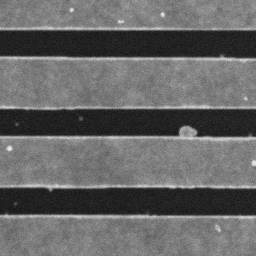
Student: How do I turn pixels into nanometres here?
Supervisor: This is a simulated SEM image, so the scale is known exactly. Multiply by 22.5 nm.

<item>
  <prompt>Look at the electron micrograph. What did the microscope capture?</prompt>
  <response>lines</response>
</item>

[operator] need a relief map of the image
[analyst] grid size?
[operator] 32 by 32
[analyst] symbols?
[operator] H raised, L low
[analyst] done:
HHHHHHHHHHHHHHHHHHHHHHHHHHHHHHHH
HHHHHHHHHHHHHHHHHHHHHHHHHHHHHHHH
HHHHHHHHHHHHHHHHHHHHHHHHHHHHHHHH
HHHHHHHHHHHHHHHHHHHHHHHHHHHHHHHH
LLLLLLLLLLLLLLLLLLLLLLLLLLLLLLLL
LLLLLLLLLLLLLLLLLLLLLLLLLLLLLLLL
LLLLLLLLLLLLLLLLLLLLLLLLLLLLLLLL
HHHHHHHHHHHHHHHHHHHHHHHHHHHHHHHH
HHHHHHHHHHHHHHHHHHHHHHHHHHHHHHHH
HHHHHHHHHHHHHHHHHHHHHHHHHHHHHHHH
HHHHHHHHHHHHHHHHHHHHHHHHHHHHHHHH
HHHHHHHHHHHHHHHHHHHHHHHHHHHHHHHH
HHHHHHHHHHHHHHHHHHHHHHHHHHHHHHHH
HHHHHHHHHHHHHHHHHHHHHHHHHHHHHHHH
LLLLLLLLLLLLLLLLLLLLLLLLLLLLLLLL
LLLLLLLLLLLLLLLLLLLLLLLLLLLLLLLL
LLLLLLLLLLLLLLLLLLLLLLLLLLLLLLLL
HHHHHHHHHHHHHHHHHHHHHHHHHHHHHHHH
HHHHHHHHHHHHHHHHHHHHHHHHHHHHHHHH
HHHHHHHHHHHHHHHHHHHHHHHHHHHHHHHH
HHHHHHHHHHHHHHHHHHHHHHHHHHHHHHHH
HHHHHHHHHHHHHHHHHHHHHHHHHHHHHHHH
HHHHHHHHHHHHHHHHHHHHHHHHHHHHHHHH
LLLLLLLLLLLLLLLLLLLLLLLLLLLLLLLL
LLLLLLLLLLLLLLLLLLLLLLLLLLLLLLLL
LLLLLLLLLLLLLLLLLLLLLLLLLLLLLLLL
LLLLLLLLLLLLLLLLLLLLLLLLLLLLLLLL
HHHHHHHHHHHHHHHHHHHHHHHHHHHHHHHH
HHHHHHHHHHHHHHHHHHHHHHHHHHHHHHHH
HHHHHHHHHHHHHHHHHHHHHHHHHHHHHHHH
HHHHHHHHHHHHHHHHHHHHHHHHHHHHHHHH
HHHHHHHHHHHHHHHHHHHHHHHHHHHHHHHH